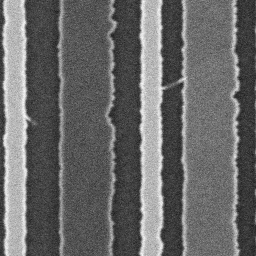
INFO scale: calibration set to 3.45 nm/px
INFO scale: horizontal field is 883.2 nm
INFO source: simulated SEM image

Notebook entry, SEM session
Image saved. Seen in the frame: lines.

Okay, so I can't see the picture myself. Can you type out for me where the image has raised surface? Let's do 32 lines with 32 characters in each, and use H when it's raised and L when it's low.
LHHLLLLLHHHHHHLLLLHHLLLHHHHHHLLL
LHHLLLLLHHHHHHLLLLHHLLLHHHHHHHLL
LHHLLLLHHHHHHHLLLLHHLLLHHHHHHLLL
LHHLLLLHHHHHHHLLLLHHLLLHHHHHHLLL
LHHLLLLHHHHHHHLLLLHHLLLHHHHHHLLL
HHHLLLLHHHHHHHLLLLHHLLLHHHHHHLLL
LHHLLLLHHHHHHHLLLLHHLLLHHHHHHLLL
LHHLLLLHHHHHHHLLLLHHLLLHHHHHHHLL
LHHLLLLHHHHHHHLLLLHHLLLHHHHHHHLL
LHHLLLLHHHHHHHLLLLHHLLLHHHHHHHLL
LHHLLLLLHHHHHHLLLLHHLLLHHHHHHHLL
LHHLLLLHHHHHHHLLLLHHLLLHHHHHHLLL
LHHLLLLHHHHHHHLLLLHHLLLHHHHHHLLL
LHHLLLLHHHHHHHLLLLHHLLLHHHHHHHLL
LHHLLLLLHHHHHHLLLLHHLLLHHHHHHHLL
LHHLLLLLHHHHHHLLLLHHLLLHHHHHHHLL
LHHLLLLLHHHHHHLLLLHHLLLHHHHHHHLL
LHHLLLLLHHHHHHLLLLHHLLLHHHHHHHLL
LHHLLLLHHHHHHHLLLLHHLLLHHHHHHHLL
LHHLLLLHHHHHHHLLLLHHLLLHHHHHHHLL
LHHLLLLLHHHHHHLLLLHHLLLHHHHHHLLL
LHHLLLLLHHHHHHLLLLHHLLLHHHHHHHLL
LHHLLLLHHHHHHHLLLLHHLLLHHHHHHHLL
LHHLLLLHHHHHHHLLLLHHLLLHHHHHHHLL
LHHLLLLHHHHHHHLLLLHHLLLHHHHHHHLL
LHHLLLLLHHHHHHLLLLHHLLLHHHHHHHLL
LHHLLLLHHHHHHHLLLLHHLLLHHHHHHHLL
LHHLLLLHHHHHHHLLLLHHLLLHHHHHHLLL
LHHLLLLHHHHHHHLLLLHHLLLHHHHHHHLL
LHHLLLLLHHHHHHLLLLHHLLLHHHHHHHLL
LHHLLLLLHHHHHHLLLLHHLLLHHHHHHHLL
LHHLLLLHHHHHHHLLLLHHLLLHHHHHHHLL